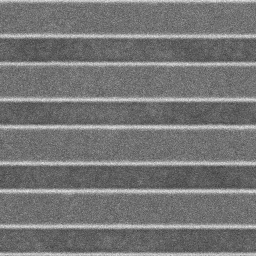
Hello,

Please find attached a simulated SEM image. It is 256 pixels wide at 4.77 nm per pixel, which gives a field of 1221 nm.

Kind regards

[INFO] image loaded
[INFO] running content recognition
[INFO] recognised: one or a few lines or trenches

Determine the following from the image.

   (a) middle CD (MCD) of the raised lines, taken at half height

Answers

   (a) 182 nanometres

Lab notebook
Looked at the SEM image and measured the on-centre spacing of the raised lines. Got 303 nanometres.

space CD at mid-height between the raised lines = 0.12 µm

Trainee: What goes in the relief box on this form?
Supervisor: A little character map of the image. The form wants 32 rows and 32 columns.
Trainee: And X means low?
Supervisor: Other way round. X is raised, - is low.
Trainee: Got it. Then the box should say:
XXXXXXXXXXXXXXXXXXXXXXXXXXXXXXXX
XXXXXXXXXXXXXXXXXXXXXXXXXXXXXXXX
XXXXXXXXXXXXXXXXXXXXXXXXXXXXXXXX
XXXXXXXXXXXXXXXXXXXXXXXXXXXXXXXX
XXXXXXXXXXXXXXXXXXXXXXXXXXXXXXXX
--------------------------------
--------------------------------
--------------------------------
XXXXXXXXXXXXXXXXXXXXXXXXXXXXXXXX
XXXXXXXXXXXXXXXXXXXXXXXXXXXXXXXX
XXXXXXXXXXXXXXXXXXXXXXXXXXXXXXXX
XXXXXXXXXXXXXXXXXXXXXXXXXXXXXXXX
-------------------XXXXXXXXXXXXX
--------------------------------
--------------------------------
--------------------------------
XXXXXXXXXXXXXXXXXXXXXXXXXXXXXXXX
XXXXXXXXXXXXXXXXXXXXXXXXXXXXXXXX
XXXXXXXXXXXXXXXXXXXXXXXXXXXXXXXX
XXXXXXXXXXXXXXXXXXXXXXXXXXXXXXXX
XXXXXXXXXXXXXXXXXXXXXXXXXXXXXXXX
--------------------------------
--------------------------------
--------------------------------
XXXXXXXXXXXXXXXXXXXXXXXXXXXXXXXX
XXXXXXXXXXXXXXXXXXXXXXXXXXXXXXXX
XXXXXXXXXXXXXXXXXXXXXXXXXXXXXXXX
XXXXXXXXXXXXXXXXXXXXXXXXXXXXXXXX
--------------------------------
--------------------------------
--------------------------------
--------------------------------